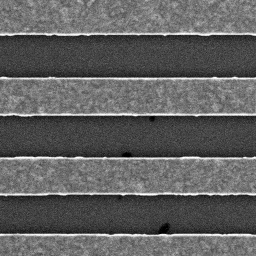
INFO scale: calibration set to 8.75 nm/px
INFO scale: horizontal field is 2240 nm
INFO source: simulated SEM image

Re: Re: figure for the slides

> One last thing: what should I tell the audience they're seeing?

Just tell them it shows lines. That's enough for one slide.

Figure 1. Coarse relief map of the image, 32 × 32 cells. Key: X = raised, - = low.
XXXXXXXXXXXXXXXXXXXXXXXXXXXXXXXX
XXXXXXXXXXXXXXXXXXXXXXXXXXXXXXXX
XXXXXXXXXXXXXXXXXXXXXXXXXXXXXXXX
XXXXXXXXXXXXXXXXXXXXXXXXXXXXXXXX
--------------------------------
--------------------------------
--------------------------------
--------------------------------
--------------------------------
--------------------------------
XXXXXXXXXXXXXXXXXXXXXXXXXXXXXXXX
XXXXXXXXXXXXXXXXXXXXXXXXXXXXXXXX
XXXXXXXXXXXXXXXXXXXXXXXXXXXXXXXX
XXXXXXXXXXXXXXXXXXXXXXXXXXXXXXXX
--------------------------------
--------------------------------
--------------------------------
--------------------------------
--------------------------------
--------------------------------
XXXXXXXXXXXXXXXXXXXXXXXXXXXXXXXX
XXXXXXXXXXXXXXXXXXXXXXXXXXXXXXXX
XXXXXXXXXXXXXXXXXXXXXXXXXXXXXXXX
XXXXXXXXXXXXXXXXXXXXXXXXXXXXXXXX
--------------------------------
--------------------------------
--------------------------------
--------------------------------
--------------------------------
XXXXXXXXXXXXXXXXXXXXXXXXXXXXXXXX
XXXXXXXXXXXXXXXXXXXXXXXXXXXXXXXX
XXXXXXXXXXXXXXXXXXXXXXXXXXXXXXXX